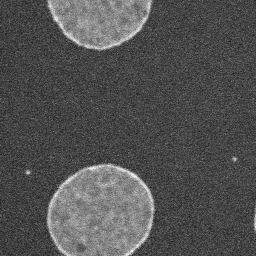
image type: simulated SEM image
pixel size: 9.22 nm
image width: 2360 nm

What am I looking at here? raised bodies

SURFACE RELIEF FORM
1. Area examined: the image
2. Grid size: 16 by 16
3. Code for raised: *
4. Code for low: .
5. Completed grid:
...******.......
....*****.......
.....***........
................
................
................
................
................
................
................
......**........
....*****.......
...******.......
...*******......
...******.......
....*****.......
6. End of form